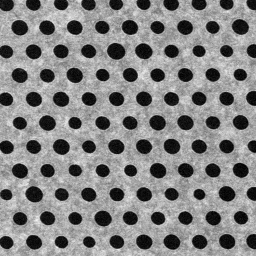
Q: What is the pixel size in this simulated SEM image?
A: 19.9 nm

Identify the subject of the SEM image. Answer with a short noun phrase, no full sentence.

a regular array of holes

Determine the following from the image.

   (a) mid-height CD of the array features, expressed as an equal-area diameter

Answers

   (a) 0.302 um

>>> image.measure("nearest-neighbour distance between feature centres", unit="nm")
543